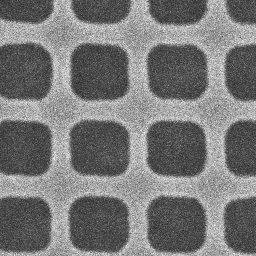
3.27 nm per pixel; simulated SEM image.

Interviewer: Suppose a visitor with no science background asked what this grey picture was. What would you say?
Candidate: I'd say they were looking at holes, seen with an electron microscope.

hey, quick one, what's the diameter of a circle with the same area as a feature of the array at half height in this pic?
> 209 nm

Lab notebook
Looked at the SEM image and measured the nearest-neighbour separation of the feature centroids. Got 0.248 microns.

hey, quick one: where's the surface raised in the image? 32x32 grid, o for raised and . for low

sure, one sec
.......oo.......oo........oo....
.......oo.......ooo.......oo....
......oooo.....oooo......oooo...
oooooooooooooooooooooooooooooooo
oooooooooooooooooooooooooooooooo
o....ooooo....oooooo....ooooooo.
......ooo.......ooo......ooo....
.......oo.......oo........oo....
.......oo.......oo........oo....
.......oo.......oo........oo....
......ooo.......oo........oo....
......ooo.......ooo.......oo....
o....ooooo....ooooooo....ooooo..
oooooooooooooooooooooooooooooooo
oooooooooooooooooooooooooooooooo
......ooo......oooo......oooo...
......ooo.......oo........oo....
.......oo.......oo........oo....
.......oo.......oo........oo....
.......oo.......oo........oo....
......ooo.......oo........oo....
......ooo.......ooo......oooo...
oooooooooooooooooooooooooooooooo
oooooooooooooooooooooooooooooooo
o....oooooo...oooooo...ooooooooo
......ooo.......ooo......ooo....
......ooo.......oo........oo....
......oo........oo........oo....
......ooo.......oo........oo....
......ooo.......oo........oo....
......ooo.......ooo.......oo....
o....oooooo....ooooo....ooooo...